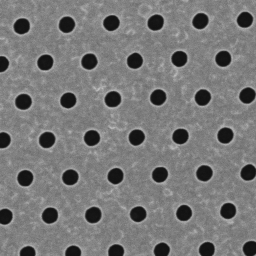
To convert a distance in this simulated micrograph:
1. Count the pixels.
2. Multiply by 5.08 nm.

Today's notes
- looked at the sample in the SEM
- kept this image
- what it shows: a regular array of holes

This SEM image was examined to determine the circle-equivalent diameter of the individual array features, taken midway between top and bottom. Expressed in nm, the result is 81.1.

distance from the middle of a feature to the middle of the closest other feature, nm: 220